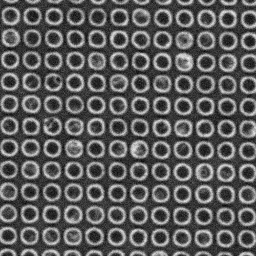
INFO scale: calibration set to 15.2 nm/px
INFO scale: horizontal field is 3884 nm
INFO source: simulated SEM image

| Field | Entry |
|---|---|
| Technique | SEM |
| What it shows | a regular array of raised bodies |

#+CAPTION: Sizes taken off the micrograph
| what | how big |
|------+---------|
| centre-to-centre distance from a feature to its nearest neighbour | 21.6 pixels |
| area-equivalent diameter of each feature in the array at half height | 0.245 micrometres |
